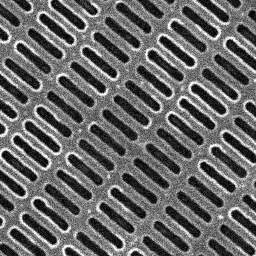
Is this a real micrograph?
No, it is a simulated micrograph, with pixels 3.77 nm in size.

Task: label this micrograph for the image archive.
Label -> a regular array of holes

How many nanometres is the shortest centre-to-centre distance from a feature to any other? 70.3